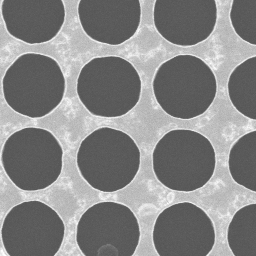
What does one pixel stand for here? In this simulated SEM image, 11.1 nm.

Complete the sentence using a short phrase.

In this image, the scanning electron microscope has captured holes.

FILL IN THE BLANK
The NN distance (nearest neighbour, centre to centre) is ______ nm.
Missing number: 814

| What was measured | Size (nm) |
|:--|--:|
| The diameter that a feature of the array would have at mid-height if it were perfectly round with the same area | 699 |